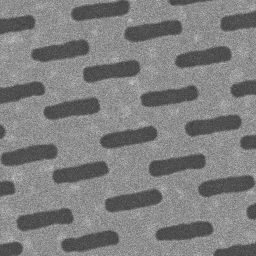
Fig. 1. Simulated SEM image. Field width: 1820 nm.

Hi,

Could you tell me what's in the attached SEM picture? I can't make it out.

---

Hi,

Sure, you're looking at a regular array of holes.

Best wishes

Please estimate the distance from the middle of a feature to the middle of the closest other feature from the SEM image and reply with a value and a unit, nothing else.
0.383 µm